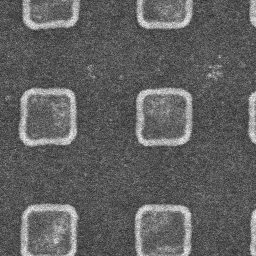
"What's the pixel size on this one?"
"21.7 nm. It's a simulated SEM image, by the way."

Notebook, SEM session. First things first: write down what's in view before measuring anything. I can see raised bodies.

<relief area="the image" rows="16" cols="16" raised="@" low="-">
--@@@----@@@----
--@@-----@@-----
----------------
----------------
----------------
----------------
-@@@@----@@@----
-@@@@----@@@----
-@@@-----@@@----
----------------
----------------
----------------
----------------
--@@@----@@@----
-@@@@----@@@----
-@@@@----@@@----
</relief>